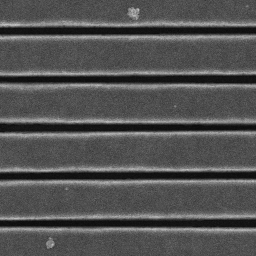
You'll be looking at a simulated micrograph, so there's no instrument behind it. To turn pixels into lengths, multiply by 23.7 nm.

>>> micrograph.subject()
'lines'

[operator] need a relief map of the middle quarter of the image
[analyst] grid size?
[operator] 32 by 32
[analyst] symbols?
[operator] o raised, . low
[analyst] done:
oooooooooooooooooooooooooooooooo
oooooooooooooooooooooooooooooooo
oooooooooooooooooooooooooooooooo
................................
................................
oooooooooooooooooooooooooooooooo
oooooooooooooooooooooooooooooooo
oooooooooooooooooooooooooooooooo
oooooooooooooooooooooooooooooooo
oooooooooooooooooooooooooooooooo
oooooooooooooooooooooooooooooooo
oooooooooooooooooooooooooooooooo
oooooooooooooooooooooooooooooooo
oooooooooooooooooooooooooooooooo
oooooooooooooooooooooooooooooooo
................................
................................
oooooooooooooooooooooooooooooooo
oooooooooooooooooooooooooooooooo
oooooooooooooooooooooooooooooooo
oooooooooooooooooooooooooooooooo
oooooooooooooooooooooooooooooooo
oooooooooooooooooooooooooooooooo
oooooooooooooooooooooooooooooooo
oooooooooooooooooooooooooooooooo
oooooooooooooooooooooooooooooooo
oooooooooooooooooooooooooooooooo
................................
................................
oooooooooooooooooooooooooooooooo
oooooooooooooooooooooooooooooooo
oooooooooooooooooooooooooooooooo